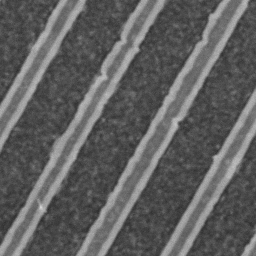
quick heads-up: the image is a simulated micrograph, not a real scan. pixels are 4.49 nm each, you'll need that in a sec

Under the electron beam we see one or a few lines or trenches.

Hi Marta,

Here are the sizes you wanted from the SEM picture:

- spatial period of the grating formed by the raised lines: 321 nm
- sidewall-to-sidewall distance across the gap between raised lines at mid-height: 242 nm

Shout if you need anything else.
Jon